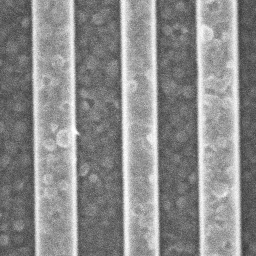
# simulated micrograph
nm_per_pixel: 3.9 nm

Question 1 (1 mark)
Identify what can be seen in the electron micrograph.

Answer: one or a few lines or trenches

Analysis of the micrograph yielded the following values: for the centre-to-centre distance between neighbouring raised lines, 320 nm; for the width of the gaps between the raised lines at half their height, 178 nm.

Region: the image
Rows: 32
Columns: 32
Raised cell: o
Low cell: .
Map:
....ooooo......oooo......oooo...
....ooooo......oooo......oooo...
....ooooo......oooo......oooo...
....ooooo......oooo......oooo...
....ooooo......oooo......oooo...
....ooooo......oooo......oooo...
....ooooo......oooo......ooooo..
....ooooo......oooo......ooooo..
....ooooo......oooo......ooooo..
....ooooo......oooo......ooooo..
....ooooo......oooo......ooooo..
....ooooo......oooo......ooooo..
....ooooo......oooo......ooooo..
....ooooo.......ooo......ooooo..
....ooooo.......ooo......ooooo..
....ooooo.......ooo......ooooo..
....ooooo.......ooo......ooooo..
....ooooo.......ooo......ooooo..
....ooooo.......ooo......ooooo..
....ooooo.......oooo.....ooooo..
....ooooo.......oooo.....ooooo..
....ooooo.......oooo.....ooooo..
....ooooo.......oooo.....ooooo..
....ooooo.......oooo.....ooooo..
.....oooo.......oooo.....ooooo..
.....oooo.......oooo.....ooooo..
.....oooo.......oooo.....ooooo..
.....oooo.......oooo.....ooooo..
.....oooo.......oooo.....ooooo..
.....oooo.......oooo.....ooooo..
.....oooo.......oooo.....ooooo..
.....oooo.......oooo.....ooooo..